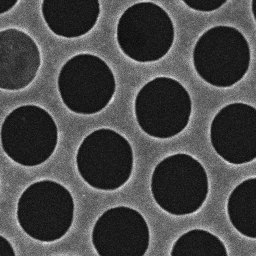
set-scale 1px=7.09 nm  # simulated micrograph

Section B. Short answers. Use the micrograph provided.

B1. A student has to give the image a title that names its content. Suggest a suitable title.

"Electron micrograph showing holes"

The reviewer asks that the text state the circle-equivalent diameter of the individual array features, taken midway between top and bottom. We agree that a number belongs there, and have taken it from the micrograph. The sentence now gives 0.417 micrometres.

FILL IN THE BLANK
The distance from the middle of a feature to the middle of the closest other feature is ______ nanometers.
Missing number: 550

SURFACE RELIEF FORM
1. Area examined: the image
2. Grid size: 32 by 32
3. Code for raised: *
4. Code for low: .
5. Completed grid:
..***.......*****..****.....***.
.****.......****.....***********
******......***......***********
******......***.......*****..***
....****..*****.......***.....**
....***********.......***......*
.....***********.....***.......*
.....****....****...****.......*
.....***......**********.......*
....***.......***********.....**
....***.......****.....***...***
********......***......*********
********......***.......********
**...****....****.......****....
*.....***********.......***.....
.......**********......***......
.......*****..****.....***......
.......***......**********......
.......***......***********.....
*.....****.......****...****....
***..*****.......***.....****.**
**********......***.......******
***********.....***.......*****.
***.....****...****.......***...
***......**********.......***...
**.......***********.....***....
**.......****....****...****....
**.......***......***********...
***......***.......**********...
****....****.......****....****.
.***********.......***......****
..**********......***.......****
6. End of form